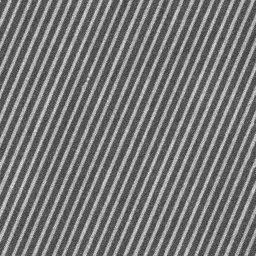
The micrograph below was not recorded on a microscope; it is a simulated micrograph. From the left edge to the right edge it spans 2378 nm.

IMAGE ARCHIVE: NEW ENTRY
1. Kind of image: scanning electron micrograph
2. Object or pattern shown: parallel lines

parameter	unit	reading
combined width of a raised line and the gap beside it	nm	86.6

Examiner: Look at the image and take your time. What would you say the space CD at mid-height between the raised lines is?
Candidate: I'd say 63.1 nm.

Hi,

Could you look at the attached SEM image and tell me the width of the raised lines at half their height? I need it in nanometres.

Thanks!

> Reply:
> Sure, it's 26.7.